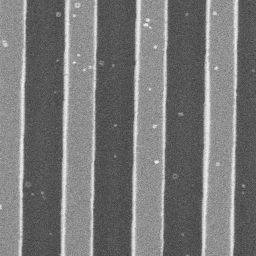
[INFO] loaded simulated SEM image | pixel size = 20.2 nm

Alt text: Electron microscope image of lines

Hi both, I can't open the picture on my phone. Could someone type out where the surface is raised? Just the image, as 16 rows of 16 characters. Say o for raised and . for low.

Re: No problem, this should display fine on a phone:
oo..oo...o...oo.
oo..oo...o...oo.
oo..oo...o...oo.
oo..oo..oo...oo.
oo..oo..oo...oo.
o...oo..oo...oo.
o...oo..oo...oo.
o...oo..oo...oo.
o...oo..oo...oo.
o...oo..oo...oo.
o...oo..oo...oo.
o...oo..oo...oo.
o...oo..oo...oo.
o...oo..oo...oo.
o...oo..oo...oo.
o...oo..oo...oo.